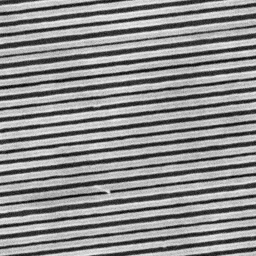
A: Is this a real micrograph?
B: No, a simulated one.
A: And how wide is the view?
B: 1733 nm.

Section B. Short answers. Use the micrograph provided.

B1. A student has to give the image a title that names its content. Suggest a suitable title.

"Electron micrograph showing parallel lines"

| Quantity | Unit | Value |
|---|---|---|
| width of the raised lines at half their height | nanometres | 37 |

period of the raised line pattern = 0.0713 micrometres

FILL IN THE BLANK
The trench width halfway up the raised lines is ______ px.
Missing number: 5.47